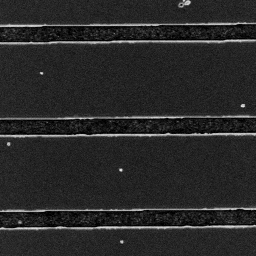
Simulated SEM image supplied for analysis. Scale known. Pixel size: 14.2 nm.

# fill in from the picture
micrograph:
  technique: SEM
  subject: lines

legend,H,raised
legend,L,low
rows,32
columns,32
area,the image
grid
HHHHHHHHHHHHHHHHHHHHHHHHHHHHHHHH
HHHHHHHHHHHHHHHHHHHHHHHHHHHHHHHH
HHHHHHHHHHHHHHHHHHHHHHHHHHHHHHHH
LLLLLLLLLLLLLLLLLLLLLLLLLLLLLLLL
LLLLLLLLLLLLLLLLLLLLLLLLLLLLLLLL
HHHHHHHHHHHHHHHHHHHHHHHHHHHHHHHH
HHHHHHHHHHHHHHHHHHHHHHHHHHHHHHHH
HHHHHHHHHHHHHHHHHHHHHHHHHHHHHHHH
HHHHHHHHHHHHHHHHHHHHHHHHHHHHHHHH
HHHHHHHHHHHHHHHHHHHHHHHHHHHHHHHH
HHHHHHHHHHHHHHHHHHHHHHHHHHHHHHHH
HHHHHHHHHHHHHHHHHHHHHHHHHHHHHHHH
HHHHHHHHHHHHHHHHHHHHHHHHHHHHHHHH
HHHHHHHHHHHHHHHHHHHHHHHHHHHHHHHH
HHHHHHHHHHHHHHHHHHHHHHHHHHHHHHHH
LLLLLLLLLLLLLLLLLLLLLLLLLLLLLLLL
LLLLLLLLLLLLLLLLLLLLLLLLLLLLLLLL
HHHHHHHHHHHHHHHHHHHHHHHHHHHHHHHH
HHHHHHHHHHHHHHHHHHHHHHHHHHHHHHHH
HHHHHHHHHHHHHHHHHHHHHHHHHHHHHHHH
HHHHHHHHHHHHHHHHHHHHHHHHHHHHHHHH
HHHHHHHHHHHHHHHHHHHHHHHHHHHHHHHH
HHHHHHHHHHHHHHHHHHHHHHHHHHHHHHHH
HHHHHHHHHHHHHHHHHHHHHHHHHHHHHHHH
HHHHHHHHHHHHHHHHHHHHHHHHHHHHHHHH
HHHHHHHHHHHHHHHHHHHHHHHHHHHHHHHH
LLLLLLLLLLLLLLLLLLLLLLLLLLLLLLLL
LLLLLLLLLLLLLLLLLLLLLLLLLLLLLLLL
LLLLLLLHLLLLHHHHHHHHHHHHHHHHHHHH
HHHHHHHHHHHHHHHHHHHHHHHHHHHHHHHH
HHHHHHHHHHHHHHHHHHHHHHHHHHHHHHHH
HHHHHHHHHHHHHHHHHHHHHHHHHHHHHHHH